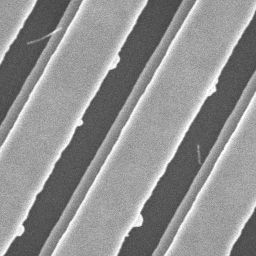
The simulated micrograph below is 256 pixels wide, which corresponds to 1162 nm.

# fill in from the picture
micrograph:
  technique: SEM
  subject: lines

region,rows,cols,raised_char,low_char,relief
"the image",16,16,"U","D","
UUDDUUUUUDDUUUUU
UDDDUUUUDDDUUUUU
UDDUUUUUDDUUUUUD
DDDUUUUDDDUUUUDD
DDUUUUUDDUUUUUDD
DUUUUUDDUUUUUDDU
DUUUUUDDUUUUUDDU
UUUUUDDUUUUUDDUU
UUUUUDDUUUUDDDUU
UUUUDDUUUUUDDUUU
UUUDDDUUUUDDDUUU
UUUDDUUUUUDDUUUU
UUDDUUUUUDDUUUUU
UUDDUUUUUDDUUUUU
UDDUUUUUDDUUUUUD
UDDUUUUUDDUUUUUD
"